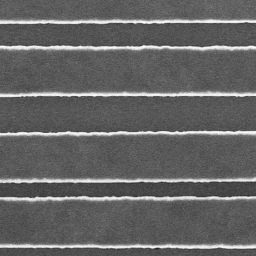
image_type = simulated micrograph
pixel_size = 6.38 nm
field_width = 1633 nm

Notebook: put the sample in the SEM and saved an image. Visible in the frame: lines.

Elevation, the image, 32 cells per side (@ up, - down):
@@@@@@@@@@@@@@@@@@@@@@@@@@@@@@@@
@@@@@@@@@@@@@@@@@@@@@@@@@@@@@@@@
@@@@@@@@@@@@@@@@@@@@@@@@@@@@@@@@
--------------------------------
--------------------------------
--------------------------------
@@@@@@@@@@@@@@@@@@@@@@@@@@@@@@@@
@@@@@@@@@@@@@@@@@@@@@@@@@@@@@@@@
@@@@@@@@@@@@@@@@@@@@@@@@@@@@@@@@
@@@@@@@@@@@@@@@@@@@@@@@@@@@@@@@@
@@@@@@@@@@@@@@@@@@@@@@@@@@@@@@@@
@@@@@@@@@@@@@@@@@@@@@@@@@@@@@@@@
--------------------------------
--------------------------------
--------------------------------
--------------------------------
------------------@@@-@-@@@--@@-
@@@@@@@@@@@@@@@@@@@@@@@@@@@@@@@@
@@@@@@@@@@@@@@@@@@@@@@@@@@@@@@@@
@@@@@@@@@@@@@@@@@@@@@@@@@@@@@@@@
@@@@@@@@@@@@@@@@@@@@@@@@@@@@@@@@
@@@@@@@@@@@@@@@@@@@@@@@@@@@@@@@@
@@@@@@@@@@@@@@@@@@@@@@@@@@@@@@@@
--------------------------------
--------------------------------
@@@@@@@@@@@@@@@@@@@@@@@@@@@@@@@@
@@@@@@@@@@@@@@@@@@@@@@@@@@@@@@@@
@@@@@@@@@@@@@@@@@@@@@@@@@@@@@@@@
@@@@@@@@@@@@@@@@@@@@@@@@@@@@@@@@
@@@@@@@@@@@@@@@@@@@@@@@@@@@@@@@@
@@@@@@@@@@@@@@@@@@@@@@@@@@@@@@@@
--------------------------------